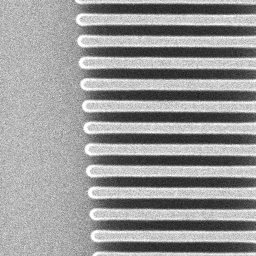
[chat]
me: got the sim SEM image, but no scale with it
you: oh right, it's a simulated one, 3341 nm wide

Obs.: groups of lines, slits or small figures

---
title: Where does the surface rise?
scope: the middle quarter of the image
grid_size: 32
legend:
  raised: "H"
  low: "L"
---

LLLLHHHHHHHHHHHHHHHHHHHHHHHHHHHH
LLLLLLLLLLLLLLLLLLLLLLLLLLLLLLLL
LLLLLLLLLLLLLLLLLLLLLLLLLLLLLLLL
LLLLLLLLLLLLLLLLLLLLLLLLLLLLLLLL
LLLLLHHHHHHHHHHHHHHHHHHHHHHHHHHH
LLLLHHHHHHHHHHHHHHHHHHHHHHHHHHHH
LLLLLLLLLHHHHHHHHHHHLHHHHHHHHHHH
LLLLLLLLLLLLLLLLLLLLLLLLLLLLLLLL
LLLLLLLLLLLLLLLLLLLLLLLLLLLLLLLL
LLLLLLHHHHHHHHHHHHHHHHHHHHHHHHHH
LLLLLHHHHHHHHHHHHHHHHHHHHHHHHHHH
LLLLLHHHHHHHHHHHHHHHHHHHHHHHHHHH
LLLLLLLLLLLLLLLLLLLLLLLLLLLLLLLL
LLLLLLLLLLLLLLLLLLLLLLLLLLLLLLLL
LLLLLLLLLLLLLLLLLLLLLLLLLLLLLLLL
LLLLLHHHHHHHHHHHHHHHHHHHHHHHHHHH
LLLLLHHHHHHHHHHHHHHHHHHHHHHHHHHH
LLLLLLLLLLLLLLLLLLLLLLLLLLLLLLLL
LLLLLLLLLLLLLLLLLLLLLLLLLLLLLLLL
LLLLLLLLLLLLLLLLLLLLLLLLLLLLLLLL
LLLLLLHHHHHHHHHHHHHHHHHHHHHHHHHH
LLLLLLHHHHHHHHHHHHHHHHHHHHHHHHHH
LLLLLLHHHHHHHHHHHHHHHHHHHHHHHHHH
LLLLLLLLLLLLLLLLLLLLLLLLLLLLLLLL
LLLLLLLLLLLLLLLLLLLLLLLLLLLLLLLL
LLLLLLLLLLLLLLLLLLLLLLLLLLLLLLLL
LLLLLLHHHHHHHHHHHHHHHHHHHHHHHHHH
LLLLLLHHHHHHHHHHHHHHHHHHHHHHHHHH
LLLLLLLLLLLLLLLLLLLLLLLLLLLLLLLL
LLLLLLLLLLLLLLLLLLLLLLLLLLLLLLLL
LLLLLLLLLLLLLLLLLLLLLLLLLLLLLLLL
LLLLLLLHHHHHHHHHHHHHHHHHHHHHHHHH